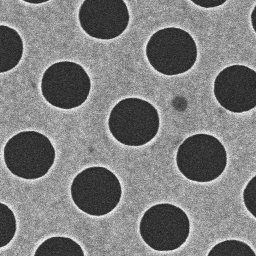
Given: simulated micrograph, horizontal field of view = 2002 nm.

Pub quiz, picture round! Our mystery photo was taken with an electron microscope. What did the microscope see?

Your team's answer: holes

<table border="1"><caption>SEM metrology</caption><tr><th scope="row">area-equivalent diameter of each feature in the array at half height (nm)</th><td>388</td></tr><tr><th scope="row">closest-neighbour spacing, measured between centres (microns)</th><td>0.6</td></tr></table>